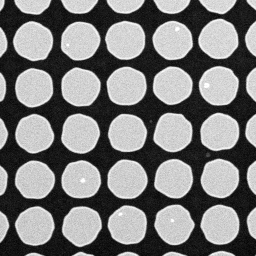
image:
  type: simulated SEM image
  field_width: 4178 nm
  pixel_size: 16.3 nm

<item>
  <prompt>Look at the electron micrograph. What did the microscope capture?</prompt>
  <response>an array of small figures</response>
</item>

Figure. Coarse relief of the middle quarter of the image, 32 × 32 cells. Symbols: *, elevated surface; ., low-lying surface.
................................
..****.......*****.......*****..
********....********...********.
*********..*********...*********
*********..*********..**********
*********..**********.**********
*********..**********.**********
*********..*********...*********
********...*********...********.
.******.....*******......****...
................................
................................
...*.....................***....
.******......******.....******..
********....********...********.
********...*********...*********
*********..**********..*********
*********..**********.**********
*********..**********.**********
********....********...*********
********....********....*******.
.******......*****.......****...
................................
................................
...***.......*****.......*****..
.******.....*******.....*******.
*********..*********...*********
*********..**********..*********
*********..**********..*********
*********..**********..*********
*********..**********..*********
********....********...********.